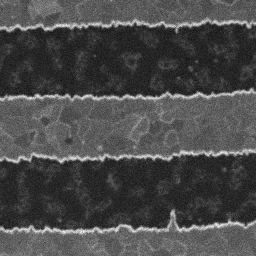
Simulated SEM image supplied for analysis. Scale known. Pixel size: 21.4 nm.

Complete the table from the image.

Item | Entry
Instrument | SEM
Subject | one or a few lines or trenches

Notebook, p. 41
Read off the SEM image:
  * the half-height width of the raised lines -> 1280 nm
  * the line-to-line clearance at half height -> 1540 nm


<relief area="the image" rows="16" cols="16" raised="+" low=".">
++++++++++++++++
+++++++..+++....
................
................
................
................
++++++++++++++++
++++++++++++++++
++++++++++++++++
++++++++++++++++
................
................
................
................
++++++++++++++++
++++++++++++++++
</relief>